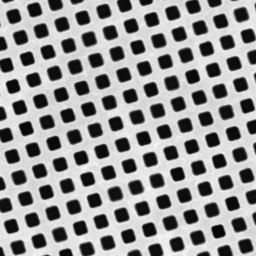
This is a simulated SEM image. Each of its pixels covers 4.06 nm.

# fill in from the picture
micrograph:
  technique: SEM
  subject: a regular array of holes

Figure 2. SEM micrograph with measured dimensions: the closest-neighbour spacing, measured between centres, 87.3 nanometres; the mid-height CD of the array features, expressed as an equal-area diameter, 57.9 nm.